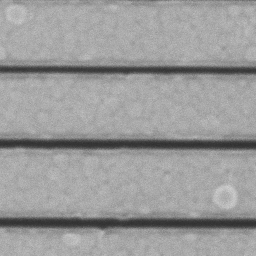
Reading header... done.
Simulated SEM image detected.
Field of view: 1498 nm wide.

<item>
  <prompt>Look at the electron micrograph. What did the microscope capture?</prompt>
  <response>one or a few lines or trenches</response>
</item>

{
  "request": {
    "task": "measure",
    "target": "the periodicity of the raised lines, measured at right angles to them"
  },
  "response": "446 nm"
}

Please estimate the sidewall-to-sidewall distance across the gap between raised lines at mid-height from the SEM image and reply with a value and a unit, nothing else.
364 nanometres